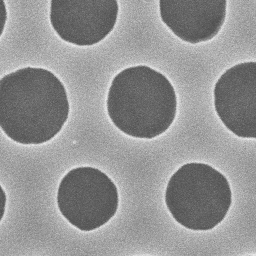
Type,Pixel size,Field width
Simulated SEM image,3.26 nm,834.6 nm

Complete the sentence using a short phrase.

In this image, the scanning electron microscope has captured holes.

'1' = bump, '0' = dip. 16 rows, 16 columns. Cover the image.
1110000111000011
1110000111000011
1111001111100111
1111111111111111
1001111100111100
0000111000011000
0000111000011000
0000111000011100
1001111100111110
1111111111111111
1111101111100111
1111000111000011
1111000111000011
1111000111100011
1111111111111111
1111111111111111